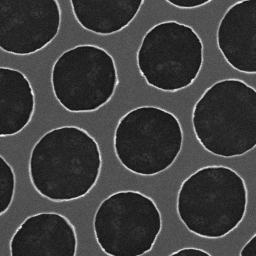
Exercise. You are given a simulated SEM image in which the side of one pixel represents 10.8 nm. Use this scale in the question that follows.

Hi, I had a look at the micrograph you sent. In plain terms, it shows holes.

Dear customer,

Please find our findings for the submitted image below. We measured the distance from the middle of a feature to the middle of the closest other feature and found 938 nanometres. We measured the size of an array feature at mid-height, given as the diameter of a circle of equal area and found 715 nanometres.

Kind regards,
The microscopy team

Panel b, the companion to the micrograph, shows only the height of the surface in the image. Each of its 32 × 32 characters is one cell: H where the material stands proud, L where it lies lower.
LLLLLLLHHLLLLLLLLLHHHHLLLHHHHHLL
LLLLLLLHHLLLLLLLLHHHHHHHHHHHHLLL
LLLLLLLHHHLLLLLLHHHHHHHHHHHHLLLL
LLLLLLLHHHHLLLLHHHHLLLLLHHHLLLLL
LLLLLLLHHHHHHHHHHHLLLLLLLHHLLLLL
LLLLLLHHHHHHHHHHHHLLLLLLLHHLLLLL
HLLLHHHHLLLLLHHHHLLLLLLLLHHHLLLL
HHHHHHHLLLLLLLHHHLLLLLLLLHHHLLLL
HHHHHHHLLLLLLLHHHHLLLLLLLHHHHHLL
LLLHHHHLLLLLLLHHHHLLLLLLHHHHHHHH
LLLLHHHLLLLLLLHHHHHLLLLHHHHLLLHH
LLLLHHHLLLLLLLHHHHHHHHHHHHLLLLLL
LLLLHHHLLLLLLHHHHHHHHHHHHLLLLLLL
LLLLHHHHLLLLHHHHHHLHHHHHLLLLLLLL
LLLLHHHHHHHHHHHHLLLLLLHHLLLLLLLL
LLLHHHHHHHHHHHHLLLLLLLHHLLLLLLLL
LLHHHHLLLLHHHHHLLLLLLLLHHLLLLLLL
HHHHHLLLLLLLHHLLLLLLLLLHHLLLLLLL
HHHHLLLLLLLLHHLLLLLLLLHHHHLLLLLH
HHHHLLLLLLLLHHHLLLLLLLHHHHHHLHHH
LHHHLLLLLLLLHHHLLLLLLHHHHHHHHHHH
LLHHLLLLLLLLHHHHHLLLHHHHHLLLLHHH
LLHHLLLLLLLLHHHHHHHHHHHLLLLLLLHH
LLHHHLLLLLLHHHHHHHHHHHHLLLLLLLLH
LHHHHHLLLLHHHHLLLLHHHHLLLLLLLLLH
LHHHHHHHHHHHHLLLLLLHHHLLLLLLLLLH
HHHHHHHHHHHHLLLLLLLLHHLLLLLLLLHH
HHHLLLLLHHHHLLLLLLLLHHHLLLLLLLHH
HHHLLLLLLHHHLLLLLLLLHHHHLLLLLHHH
HHLLLLLLLHHHLLLLLLLLHHHHHHLLHHHH
HLLLLLLLLHHHHLLLLLLHHHHHHHHHHHHL
HLLLLLLLLHHHHLLLLLHHHHLLLHHHHHLL